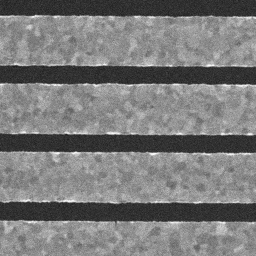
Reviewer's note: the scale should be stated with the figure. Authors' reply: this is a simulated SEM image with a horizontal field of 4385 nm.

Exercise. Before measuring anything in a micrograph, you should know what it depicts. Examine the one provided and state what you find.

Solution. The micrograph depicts one or a few lines or trenches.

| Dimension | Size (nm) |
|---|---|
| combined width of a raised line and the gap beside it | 1170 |